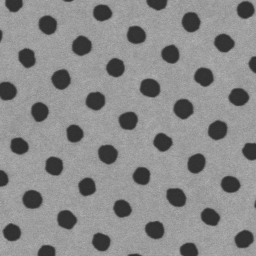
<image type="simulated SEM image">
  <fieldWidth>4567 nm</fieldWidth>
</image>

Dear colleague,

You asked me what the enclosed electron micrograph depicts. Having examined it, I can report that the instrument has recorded a regular array of holes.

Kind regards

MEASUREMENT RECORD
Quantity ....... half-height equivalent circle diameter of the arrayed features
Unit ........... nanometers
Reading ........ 332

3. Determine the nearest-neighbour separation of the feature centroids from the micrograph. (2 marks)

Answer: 690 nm